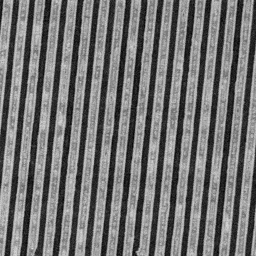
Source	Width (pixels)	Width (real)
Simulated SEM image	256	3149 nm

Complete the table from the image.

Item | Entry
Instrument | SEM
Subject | parallel lines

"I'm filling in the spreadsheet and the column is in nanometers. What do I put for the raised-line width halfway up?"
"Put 96.4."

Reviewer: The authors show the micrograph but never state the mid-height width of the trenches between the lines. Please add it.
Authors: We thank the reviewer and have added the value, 96.4 nanometers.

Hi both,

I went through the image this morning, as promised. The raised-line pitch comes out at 196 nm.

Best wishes